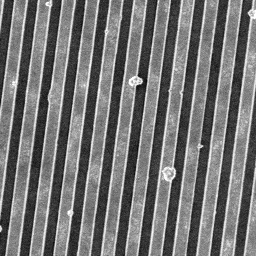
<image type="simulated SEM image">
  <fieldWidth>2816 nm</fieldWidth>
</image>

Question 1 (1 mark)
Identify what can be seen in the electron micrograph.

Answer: parallel lines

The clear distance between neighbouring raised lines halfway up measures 121 nanometers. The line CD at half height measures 140 nanometers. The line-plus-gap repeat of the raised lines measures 260 nanometres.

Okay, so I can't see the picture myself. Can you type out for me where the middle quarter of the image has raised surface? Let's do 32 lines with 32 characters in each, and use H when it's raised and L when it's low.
LLLLHHLLLLHHLLLLHHLLLHHHLLLLHHLL
LLLHHHLLLHHHLLLHHHLLLHHHLLLHHHLL
LLLHHHLLLHHHLLLHHHLLLHHHLLLHHHLL
LLLHHHLLLHHHLLLHHHHLLHHHLLLHHHLL
LLLHHHLLLHHHLLLHHHHHLHHHLLLHHHLL
LLLHHHLLLHHHLLLHHHLLLHHHLLLHHHLL
LLLHHHLLLHHHLLLHHHLLLHHHLLHHHHLL
LLLHHHLLLHHHLLHHHHLLLHHLLLHHHLLL
LLLHHLLLLHHLLLHHHLLLLHHLLLHHHLLL
LLHHHLLLHHHLLLHHHLLLHHHLLLHHHLLL
LLHHHLLLHHHLLLHHHLLLHHHLLLHHHLLL
LLHHHLLLHHHLLLHHHLLLHHHLLLHHHLLL
LLHHHLLLHHHLLLHHHLLLHHHLLLHHHLLL
LLHHHLLLHHHLLLHHHLLLHHHLLLHHHLLL
LLHHHLLLHHHLLLHHHLLLHHHLLLHHHLLL
LLHHHLLLHHHLLLHHLLLLHHLLLHHHLLLH
LLHHLLLLHHLLLHHHHLLLHHLLLHHHLLLH
LHHHLLLHHHLLLHHHLLLHHHLLLHHHLLLH
LHHHLLLHHHLLLHHHLLLHHHLLLHHHLLLH
LHHHLLLHHHLLLHHHLLLHHHLLLHHHLLLH
LHHHLLLHHHLLLHHHLLLHHHLLLHHHLLLH
LHHHLLLHHHLLLHHHLLLHHHLLLHHHLLLH
LHHHLLLHHHLLLHHHLLLHHHLLLHHHLLLH
LHHLLLLHHLLLLHHHLLLHHLLLHHHLLLLH
LHHLLLLHHLLLHHHHLLHHHLLLHHHLLLHH
HHHLLLHHHLLLHHHLLLHHHLLLHHHLLLHH
HHHLLLHHHLLLHHHLLLHHHLLLHHHHLLHH
HHHLLLHHHLLLHHHLLLHHHLLLHHHHLLHH
HHHLLLHHHLLLHHHLLLHHHLLLHHHLLLHH
HHHLLLHHHLLLHHHLLLHHHLLLHHHLLLHH
HHHLLLHHHLLLHHHLLLHHHLLLHHHLLLHH
HHLLLLHHLLLHHHLLLLHHLLLLHHLLLLHH